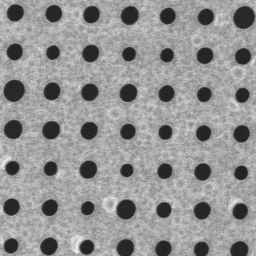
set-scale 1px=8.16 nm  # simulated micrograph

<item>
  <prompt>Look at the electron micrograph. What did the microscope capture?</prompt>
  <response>a regular array of holes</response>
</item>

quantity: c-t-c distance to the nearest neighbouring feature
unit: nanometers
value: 310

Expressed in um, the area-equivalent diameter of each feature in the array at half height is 0.134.